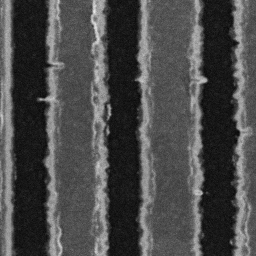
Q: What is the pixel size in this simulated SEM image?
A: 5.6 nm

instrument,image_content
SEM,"one or a few lines or trenches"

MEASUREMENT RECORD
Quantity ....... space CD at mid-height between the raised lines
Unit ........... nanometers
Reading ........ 232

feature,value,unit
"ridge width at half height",0.297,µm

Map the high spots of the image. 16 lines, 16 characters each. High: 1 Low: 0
0001110001110001
0001110001110001
0001110001110001
1001110001110001
1001110001110001
0001110001110001
1001110001110001
1001110001110001
1001110001110001
0001110001110001
1001110001110001
1001110001110001
1001110001110001
1001110001110001
1001111001110001
1001111001110001